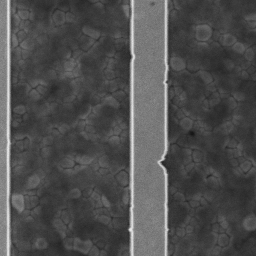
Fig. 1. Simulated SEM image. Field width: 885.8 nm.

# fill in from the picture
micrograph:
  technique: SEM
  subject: one or a few lines or trenches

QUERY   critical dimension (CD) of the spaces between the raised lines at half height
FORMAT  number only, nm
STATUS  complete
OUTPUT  426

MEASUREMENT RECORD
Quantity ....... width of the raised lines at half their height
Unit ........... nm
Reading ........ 118